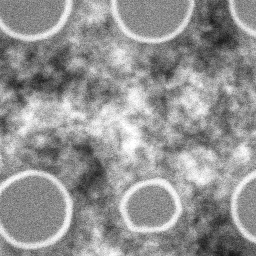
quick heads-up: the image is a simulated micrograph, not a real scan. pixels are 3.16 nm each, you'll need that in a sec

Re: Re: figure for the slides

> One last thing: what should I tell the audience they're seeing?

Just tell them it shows raised bodies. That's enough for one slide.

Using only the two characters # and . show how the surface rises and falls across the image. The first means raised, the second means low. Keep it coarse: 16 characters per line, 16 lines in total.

####...#####..##
####...#####...#
.........#......
................
................
................
................
................
................
................
................
####.....#.....#
####....###....#
####....###....#
####...........#
................